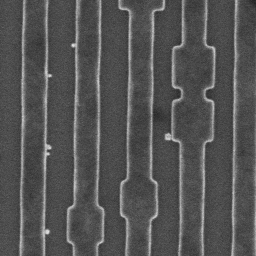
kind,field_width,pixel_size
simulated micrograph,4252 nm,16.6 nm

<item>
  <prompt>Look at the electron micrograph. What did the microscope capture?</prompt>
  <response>wiring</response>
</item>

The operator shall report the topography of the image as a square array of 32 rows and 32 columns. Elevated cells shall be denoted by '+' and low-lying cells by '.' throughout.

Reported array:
...+++....+++..+++++...+++....++
...+++....+++...++++...+++...+++
...+++....+++...+++....+++...+++
...+++....+++...+++....+++...+++
...+++....+++...+++....+++...+++
...+++....+++...+++....+++...+++
...+++....+++...+++...+++++..+++
...+++....++....+++...+++++..+++
...+++....++....+++...+++++..+++
...+++....++....+++...+++++..+++
...+++....++....+++...+++++..+++
...+++...+++....+++....+++...+++
...+++...+++....+++...++++...+++
...+++...+++....+++...+++++..+++
...+++...+++....+++...+++++..+++
...+++...+++....+++...+++++..+++
...+++...+++....+++...+++++..+++
...+++...+++....+++...++++...+++
...+++...+++....+++....+++...+++
...+++...+++....+++....++....+++
...+++...+++....+++....++....+++
...+++...+++....+++....++....+++
...+++...+++....+++....++....+++
...+++...+++...+++++...++....+++
...+++...+++...+++++...++....+++
...+++...+++...+++++...++....+++
...+++..+++++..+++++...++....+++
...++...+++++...+++....++....+++
...++...+++++...+++....++....+++
...++...+++++...+++....++....+++
...++....++++...+++...+++....+++
...++....+++....+++...+++....+++